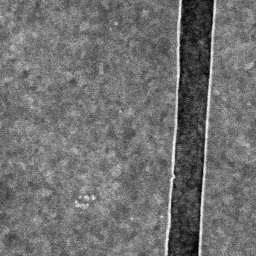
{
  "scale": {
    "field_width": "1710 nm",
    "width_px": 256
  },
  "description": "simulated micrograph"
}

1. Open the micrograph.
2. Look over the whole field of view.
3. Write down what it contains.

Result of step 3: one or a few lines or trenches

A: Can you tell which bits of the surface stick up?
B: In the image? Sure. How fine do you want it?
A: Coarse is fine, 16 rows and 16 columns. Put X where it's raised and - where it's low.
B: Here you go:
XXXXXXXXXXX--XXX
XXXXXXXXXXX--XXX
XXXXXXXXXXX--XXX
XXXXXXXXXXX--XXX
XXXXXXXXXXX--XXX
XXXXXXXXXXX--XXX
XXXXXXXXXXX--XXX
XXXXXXXXXXX--XXX
XXXXXXXXXXX--XXX
XXXXXXXXXXX--XXX
XXXXXXXXXXX--XXX
XXXXXXXXXXX--XXX
XXXXXXXXXXX--XXX
XXXXXXXXXXX--XXX
XXXXXXXXXX---XXX
XXXXXXXXXX---XXX